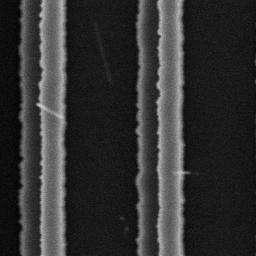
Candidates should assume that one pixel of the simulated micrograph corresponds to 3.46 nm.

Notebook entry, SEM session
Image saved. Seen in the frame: lines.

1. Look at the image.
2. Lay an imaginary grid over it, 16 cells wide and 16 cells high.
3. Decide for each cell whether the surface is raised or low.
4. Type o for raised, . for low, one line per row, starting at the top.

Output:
.ooo.....oo.....
.ooo.....oo.....
.ooo.....oo.....
.ooo.....oo.....
.ooo.....oo.....
.ooo.....oo.....
.ooo.....oo.....
.ooo.....oo.....
.ooo.....oo.....
.ooo.....oo.....
.ooo.....oo.....
.ooo.....oo.....
.ooo.....oo.....
.ooo.....oo.....
.ooo.....oo.....
.ooo.....oo.....